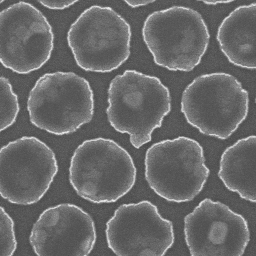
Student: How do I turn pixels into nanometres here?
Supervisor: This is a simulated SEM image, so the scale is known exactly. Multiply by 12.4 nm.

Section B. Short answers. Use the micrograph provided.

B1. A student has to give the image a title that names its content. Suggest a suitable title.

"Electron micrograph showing raised bodies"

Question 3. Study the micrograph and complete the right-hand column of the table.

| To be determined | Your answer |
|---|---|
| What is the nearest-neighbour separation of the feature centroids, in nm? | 920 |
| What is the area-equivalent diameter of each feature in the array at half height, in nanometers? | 786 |